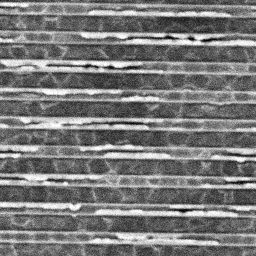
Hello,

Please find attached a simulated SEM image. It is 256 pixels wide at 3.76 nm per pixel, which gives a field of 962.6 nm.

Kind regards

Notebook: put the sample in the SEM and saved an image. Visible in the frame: parallel lines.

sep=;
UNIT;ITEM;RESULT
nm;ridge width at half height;41.3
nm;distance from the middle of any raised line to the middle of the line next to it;107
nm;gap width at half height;63.9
